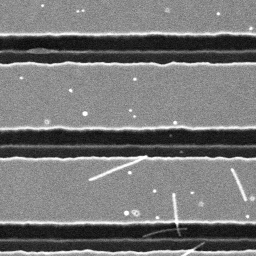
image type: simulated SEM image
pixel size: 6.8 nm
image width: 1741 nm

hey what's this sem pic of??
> lines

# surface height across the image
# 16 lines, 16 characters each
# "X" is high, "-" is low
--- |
XXXXXXXXXXXXXXXX
XXXXXXXXXXXXXXXX
----------------
----------------
XXXXXXXXXXXXXXXX
XXXXXXXXXXXXXXXX
XXXXXXXXXXXXXXXX
XXXXXXXXXXXXXXXX
----------------
----------------
XXXXXXXXXXXXXXXX
XXXXXXXXXXXXXXXX
XXXXXXXXXXXXXXXX
XXXXXXXXXXXXXXXX
----------------
----------------